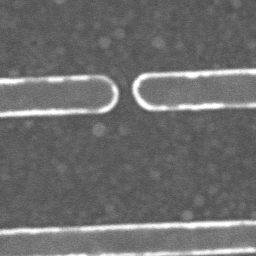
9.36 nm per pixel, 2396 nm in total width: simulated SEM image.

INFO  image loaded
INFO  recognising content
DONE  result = one or a few lines or trenches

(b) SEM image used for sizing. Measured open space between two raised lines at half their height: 1.07 µm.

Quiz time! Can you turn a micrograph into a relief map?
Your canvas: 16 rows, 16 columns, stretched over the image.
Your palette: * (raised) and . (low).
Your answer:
................
................
................
................
.............***
*******.********
*******..*******
................
................
................
................
................
................
................
****************
****************